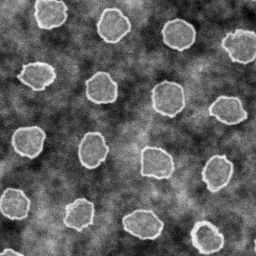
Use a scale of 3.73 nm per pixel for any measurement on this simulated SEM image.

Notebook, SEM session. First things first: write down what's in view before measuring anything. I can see a regular array of raised bodies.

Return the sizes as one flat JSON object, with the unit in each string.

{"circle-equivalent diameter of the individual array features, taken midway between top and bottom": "116 nanometers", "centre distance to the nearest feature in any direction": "234 nm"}